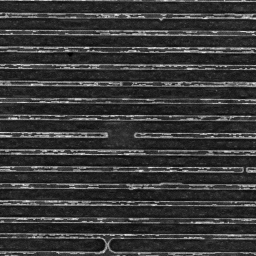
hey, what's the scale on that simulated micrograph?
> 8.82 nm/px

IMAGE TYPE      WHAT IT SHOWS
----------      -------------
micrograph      parallel lines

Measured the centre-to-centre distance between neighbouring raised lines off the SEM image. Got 150 nanometres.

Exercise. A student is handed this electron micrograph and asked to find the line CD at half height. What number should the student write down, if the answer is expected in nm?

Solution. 43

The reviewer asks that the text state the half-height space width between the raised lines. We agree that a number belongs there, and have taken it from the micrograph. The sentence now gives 104 nm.